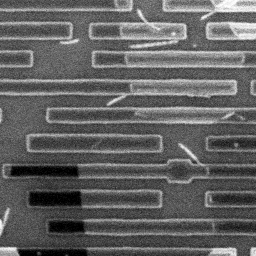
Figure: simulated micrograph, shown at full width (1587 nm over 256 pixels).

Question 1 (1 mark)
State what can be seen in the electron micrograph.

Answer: wiring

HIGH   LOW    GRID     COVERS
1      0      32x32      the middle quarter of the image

00000001111111111111111111111111
00000000000000000000000000000000
00000000000000000000000000000000
00000000000000000000000000000000
11111111111111111111111111111111
11111111111111111111111111111111
11111111111111111111111111111111
00000111011111111111111111111111
00000000000000000000000000000000
00000000000000000000000000000000
00000000000000000000000000000000
11111111111111111111111111111111
11111111111111111111111111111111
11111111111111111111111111111111
01111100000000000000000000000000
00000000000000000000000000000000
00000000000000000000000000000000
00000000000000000000000000000000
11111111111111111111111100000000
11111111111111111111111100000000
11111111111111111111111100000000
11111111111111111111111100000000
00000000000000000000000000000000
00000000000000000000000000000000
00000000000000000000000000111111
11111111111111111111111111111111
11111111111111111111111111111111
11111111111111111111111111111111
00000000000000000000000001111111
00000000000000000000000000000000
00000000000000000000000000000000
00000000000000000000000000000000